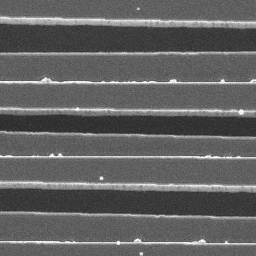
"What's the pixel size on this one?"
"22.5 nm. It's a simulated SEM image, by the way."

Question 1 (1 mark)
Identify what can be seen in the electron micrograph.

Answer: lines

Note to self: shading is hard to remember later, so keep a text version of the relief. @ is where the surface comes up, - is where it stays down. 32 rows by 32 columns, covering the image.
@@@@@@@@@@@@@@@@@@@@@@@@@@@@@@@@
@@@@@@@@@@@@@@@@@@@@@@@@@@@@@@@@
---@@@@@@@@@@@@@@@@@@@@@@@@@@@@@
--------------------------------
--------------------------------
--------------------------------
--------------------------------
@@@@@@@@@@@@@@@@@@@@@@@@@@@@@@@@
@@@@@@@@@@@@@@@@@@@@@@@@@@@@@@@@
@@@@@@@@@@@@@@@@@@@@@@@@@@@@@@@@
@@@@@@@@@@@@@@@@@@@@@@@@@@@@@@@@
@@@@@@@@@@@@@@@@@@@@@@@@@@@@@@@@
@@@@@@@@@@@@@@@@@@@@@@@@@@@@@@@@
@@@@@@@@@@@@@@@@@@@@@@@@@@@@@@@@
--------------------------------
--------------------------------
--------------------------------
@@@@@@@@@@@@@@@@@@@@@@@@@@@@@@@@
@@@@@@@@@@@@@@@@@@@@@@@@@@@@@@@@
@@@@@@@@@@@@@@@@@@@@@@@@@@@@@@@@
@@@@@@@@@@@@@@@@@@@@@@@@@@@@@@@@
@@@@@@@@@@@@@@@@@@@@@@@@@@@@@@@@
@@@@@@@@@@@@@@@@@@@@@@@@@@@@@@@@
-------------------------------@
--------------------------------
--------------------------------
--------------------------------
@@@@@@@@@@@@@@@@@@@@@@@@@@@@@@@@
@@@@@@@@@@@@@@@@@@@@@@@@@@@@@@@@
@@@@@@@@@@@@@@@@@@@@@@@@@@@@@@@@
@@@@@@@@@@@@@@@@@@@@@@@@@@@@@@@@
@@@@@@@@@@@@@@@@@@@@@@@@@@@@@@@@